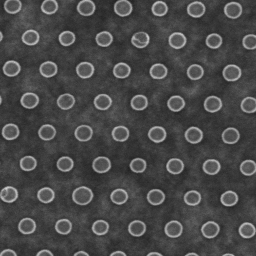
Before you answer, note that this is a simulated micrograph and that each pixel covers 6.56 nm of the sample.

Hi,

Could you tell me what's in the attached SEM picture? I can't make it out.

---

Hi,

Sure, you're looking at a regular array of raised bodies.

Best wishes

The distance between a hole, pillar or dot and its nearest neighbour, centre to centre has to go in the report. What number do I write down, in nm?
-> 237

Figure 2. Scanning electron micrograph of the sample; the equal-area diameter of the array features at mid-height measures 99.3 nm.